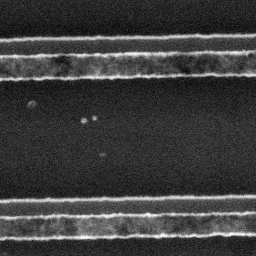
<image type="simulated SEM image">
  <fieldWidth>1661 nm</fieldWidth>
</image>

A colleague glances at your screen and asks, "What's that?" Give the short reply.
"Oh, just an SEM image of lines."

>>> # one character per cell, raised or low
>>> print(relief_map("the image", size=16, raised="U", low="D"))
DDDDDDDDDDDDDDDD
DDDDDDDDDDDDDDDD
DUUUUUUUUUUUUUUU
UUUUUUUUUUUUUUUU
UUUUUUUUUUUUUUUU
DDDDDDDDDDDDDDDD
DDDDDDDDDDDDDDDD
DDDDDDDDDDDDDDDD
DDDDDDDDDDDDDDDD
DDDDDDDDDDDDDDDD
DDDDDDDDDDDDDDDD
DDDDDDDDDDDDDDDD
DDDDDUUUUUUUUUUU
UUUUUUUUUUUUUUUU
UUUUUUUUUUUUUUUU
DDDDDDDDDDDDDDDD